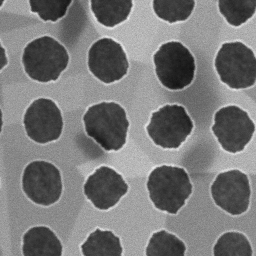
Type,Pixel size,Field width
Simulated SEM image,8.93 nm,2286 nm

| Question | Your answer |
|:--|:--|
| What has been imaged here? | a regular array of holes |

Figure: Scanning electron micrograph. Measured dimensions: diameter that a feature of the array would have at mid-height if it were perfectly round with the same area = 0.386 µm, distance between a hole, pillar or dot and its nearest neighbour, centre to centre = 554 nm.